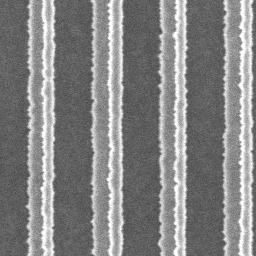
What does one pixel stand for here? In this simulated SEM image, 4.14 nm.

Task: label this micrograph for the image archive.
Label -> lines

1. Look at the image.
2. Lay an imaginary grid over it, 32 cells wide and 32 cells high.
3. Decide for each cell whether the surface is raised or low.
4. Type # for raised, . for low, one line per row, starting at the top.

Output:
....###.....###.....###.....###.
....###.....###.....###.....####
....###.....###.....###.....####
....###.....###.....###.....###.
....###.....###.....###.....###.
....###.....###.....###.....###.
....###.....###.....###.....###.
....###.....###.....###.....###.
....###.....###.....###.....###.
....###.....###.....###.....####
....###.....###.....###.....###.
....###.....###.....###.....###.
....###.....###.....###.....###.
....###.....###.....###.....###.
....###.....###.....###.....###.
....###.....###.....###.....####
....###.....###.....###.....###.
....###.....###.....###.....###.
....###.....###.....###.....###.
....###.....###.....###.....###.
....###.....###.....###.....####
....###.....###.....###.....###.
....###.....###.....###.....####
....###.....###.....###.....###.
....###.....###.....###.....###.
....##......###.....###.....###.
....###.....###.....###.....###.
....###.....###.....###.....###.
....###.....###.....###.....###.
....###.....###.....###.....####
....###.....###.....###.....###.
....###.....###.....###.....###.